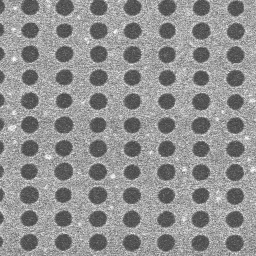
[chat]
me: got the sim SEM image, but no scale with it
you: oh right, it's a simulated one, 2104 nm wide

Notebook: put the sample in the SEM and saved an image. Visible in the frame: a regular array of holes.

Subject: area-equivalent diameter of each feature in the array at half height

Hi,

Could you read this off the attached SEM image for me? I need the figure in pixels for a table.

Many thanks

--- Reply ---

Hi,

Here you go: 17.4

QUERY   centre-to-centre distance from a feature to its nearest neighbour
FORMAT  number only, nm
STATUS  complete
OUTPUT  191